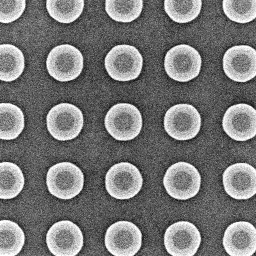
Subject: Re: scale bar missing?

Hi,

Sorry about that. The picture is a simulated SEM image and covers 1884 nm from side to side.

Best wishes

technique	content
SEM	an array of small figures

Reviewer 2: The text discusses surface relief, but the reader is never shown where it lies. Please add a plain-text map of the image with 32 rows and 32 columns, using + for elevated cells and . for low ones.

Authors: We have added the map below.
+++...++++...+++++...++++...++++
+++...++++...+++++...++++...++++
++.....++.....+++.....++.....++.
................................
................................
................................
+++...++++....+++....++++...++++
+++...++++...+++++...++++...++++
+++...++++...+++++...++++...++++
++.....+++....+++....+++....++++
................................
................................
................................
++.....+++....+++....+++.....+++
+++...++++...+++++...++++...++++
+++...++++...+++++...++++...++++
+++...++++....+++....++++...++++
...............+..............+.
................................
................................
++.....++......+......++......+.
+++...++++...++++....++++...++++
+++...++++...+++++..+++++...++++
+++...++++...+++++...++++...++++
++.....++.....+++....+++.....+++
................................
................................
................................
++....++++....+++....++++...++++
+++...++++...+++++...++++...++++
+++...++++...+++++...++++...++++
++....++++....+++....+++....++++